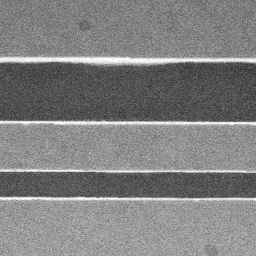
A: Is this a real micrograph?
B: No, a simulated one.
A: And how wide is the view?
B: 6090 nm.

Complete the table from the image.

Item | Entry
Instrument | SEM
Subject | lines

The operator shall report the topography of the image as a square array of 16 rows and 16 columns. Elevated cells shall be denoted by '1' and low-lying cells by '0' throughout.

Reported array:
1111111111111111
1111111111111111
1111111111111111
1111111111111111
0000000000000000
0000000000000000
0000000000000000
0000000000000000
1111111111111111
1111111111111111
1111111111111111
1111111111111111
1111111111111111
1111111111111111
1111111111111111
1111111111111111